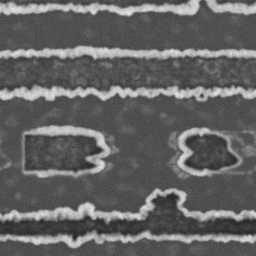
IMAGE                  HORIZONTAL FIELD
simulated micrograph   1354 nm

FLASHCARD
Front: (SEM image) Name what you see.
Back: one or a few lines or trenches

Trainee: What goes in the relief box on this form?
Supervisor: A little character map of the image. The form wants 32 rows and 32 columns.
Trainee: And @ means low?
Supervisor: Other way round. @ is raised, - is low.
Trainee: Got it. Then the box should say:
------------------------@@@-----
@@@@@@@@@@@@@@@@@@@@@@@@@@@@@@@@
@@@@@@@@@@@@@@@@@@@@@@@@@@@@@@@@
@@@@@@@@@@@@@@@@@@@@@@@@@@@@@@@@
@@@@@@@@@@@@@@@@@@@@@@@@@@@@@@@@
@@@@@@@@@@@@@@@@@@@@@@@@@@@@@@@@
@@@@@@@@@@@@@@@@@@@@@@@@@@@@@@@@
--------------------------------
--------------------------------
--------------------------------
--------------------------------
@@@@@@@@@@@@--@@@@@@@@@@@@@@@@@@
@@@@@@@@@@@@@@@@@@@@@@@@@@@@@@@@
@@@@@@@@@@@@@@@@@@@@@@@@@@@@@@@@
@@@@@@@@@@@@@@@@@@@@@@@@@@@@@@@@
@@@@@@@@@@@@@@@@@@@@@@@@@@@@@@@@
@@@@@@@@@@@@@@@@@@@@@@@@@@@@@@@@
@@@---------@@@@@@@@@@@-----@@@@
@@@----------@@@@@@@@@@------@@@
@@@---------@@@@@@@@@@@@------@@
@@@---------@@@@@@@@@@@-------@@
@@@@@-@---@@@@@@@@@@@@@@@@@@@@@@
@@@@@@@@@@@@@@@@@@@@@@@@@@@@@@@@
@@@@@@@@@@@@@@@@@@@@@@@@@@@@@@@@
@@@@@@@@@@@@@@@@@@@@--@@@@@@@@@@
@@@@@@@@@@@@@@@@@@@---@@@@@@@@@@
@@@@@@@@@@@@@@@@@@-----@@@@@@@@@
-----------------------------@--
--------------------------------
-@-----@@--@@@@@-@@-@@--@-@--@-@
@@@@@@@@@@@@@@@@@@@@@@@@@@@@@@@@
@@@@@@@@@@@@@@@@@@@@@@@@@@@@@@@@